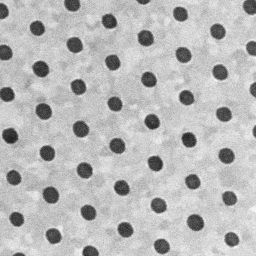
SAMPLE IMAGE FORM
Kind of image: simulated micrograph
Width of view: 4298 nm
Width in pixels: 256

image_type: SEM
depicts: a regular array of holes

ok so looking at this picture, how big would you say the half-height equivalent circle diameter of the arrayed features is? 288 nanometers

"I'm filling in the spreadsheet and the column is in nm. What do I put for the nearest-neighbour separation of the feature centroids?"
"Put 680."